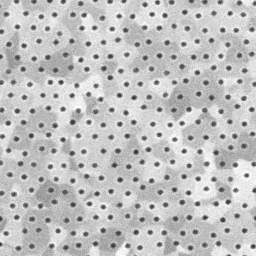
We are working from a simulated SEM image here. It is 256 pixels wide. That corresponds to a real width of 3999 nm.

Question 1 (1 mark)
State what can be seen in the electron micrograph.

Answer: a regular array of holes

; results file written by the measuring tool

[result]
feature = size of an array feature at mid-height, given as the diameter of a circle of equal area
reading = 98.1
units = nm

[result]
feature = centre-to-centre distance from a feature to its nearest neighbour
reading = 204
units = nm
